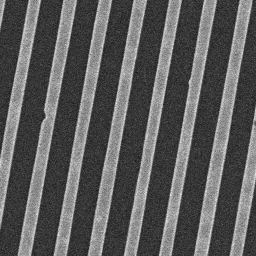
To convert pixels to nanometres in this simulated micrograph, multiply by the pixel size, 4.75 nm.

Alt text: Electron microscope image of parallel lines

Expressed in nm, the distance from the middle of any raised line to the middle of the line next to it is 165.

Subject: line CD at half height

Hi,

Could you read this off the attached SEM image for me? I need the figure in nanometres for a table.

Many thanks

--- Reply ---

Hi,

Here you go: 60.8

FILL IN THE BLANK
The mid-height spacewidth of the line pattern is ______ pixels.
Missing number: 22.7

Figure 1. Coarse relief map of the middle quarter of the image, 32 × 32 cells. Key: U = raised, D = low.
DDDDDDUUUDDDDDDUUUDDDDDDUUDDDDDD
DDDDDDUUUDDDDDUUUDDDDDDUUUDDDDDD
DDDDDUUUUDDDDDUUUDDDDDDUUUDDDDDD
DDDDDUUUDDDDDDUUUDDDDDDUUUDDDDDD
DDDDDUUUDDDDDDUUUDDDDDDUUUDDDDDU
DDDDDUUUDDDDDDUUUDDDDDDUUUDDDDDU
DDDDDUUUDDDDDUUUUDDDDDUUUDDDDDDU
DDDDDUUUDDDDDUUUDDDDDDUUUDDDDDDU
DDDDUUUDDDDDDUUUDDDDDDUUUDDDDDDU
DDDDUUUDDDDDDUUUDDDDDDUUUDDDDDDU
DDDDUUUDDDDDDUUUDDDDDDUUUDDDDDUU
DDDDUUUDDDDDDUUUDDDDDDUUDDDDDDUU
DDDDUUUDDDDDUUUUDDDDDUUUDDDDDDUU
DDDUUUUDDDDDUUUDDDDDDUUUDDDDDDUU
DDDUUUDDDDDDUUUDDDDDDUUUDDDDDDUU
DDDUUUDDDDDDUUUDDDDDDUUUDDDDDDUU
DDDUUUDDDDDDUUUDDDDDDUUUDDDDDUUU
DDDUUUDDDDDUUUUDDDDDUUUDDDDDDUUU
DDDUUDDDDDDUUUDDDDDDUUUDDDDDDUUU
DDDUUDDDDDDUUUDDDDDDUUUDDDDDDUUU
DDUUUDDDDDDUUUDDDDDDUUUDDDDDDUUU
DDUUUDDDDDDUUUDDDDDDUUUDDDDDDUUD
DDUUUDDDDDDUUUDDDDDDUUDDDDDDUUUD
DDUUUDDDDDUUUUDDDDDUUUDDDDDDUUUD
DDUUDDDDDDUUUDDDDDDUUUDDDDDDUUUD
DDUUDDDDDDUUUDDDDDDUUUDDDDDDUUUD
DUUUDDDDDDUUUDDDDDDUUUDDDDDDUUUD
DUUUDDDDDDUUUDDDDDDUUUDDDDDUUUDD
DUUUDDDDDDUUUDDDDDDUUDDDDDDUUUDD
DUUUDDDDDUUUDDDDDDUUUDDDDDDUUUDD
DUUUDDDDDUUUDDDDDDUUUDDDDDDUUUDD
UUUDDDDDDUUUDDDDDDUUUDDDDDDUUUDD